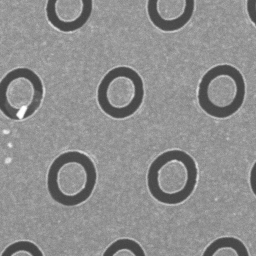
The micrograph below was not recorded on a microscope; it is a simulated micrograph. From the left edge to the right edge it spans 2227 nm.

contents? ring-shaped grooves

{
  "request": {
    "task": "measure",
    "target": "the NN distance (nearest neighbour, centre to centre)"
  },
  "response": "859 nm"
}